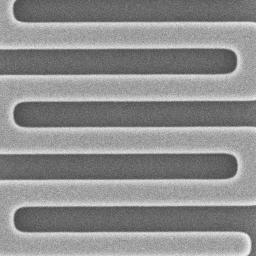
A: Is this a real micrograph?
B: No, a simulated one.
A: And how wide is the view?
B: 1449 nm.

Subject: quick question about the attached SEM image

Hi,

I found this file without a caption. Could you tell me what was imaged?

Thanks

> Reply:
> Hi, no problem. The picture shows groups of lines, slits or small figures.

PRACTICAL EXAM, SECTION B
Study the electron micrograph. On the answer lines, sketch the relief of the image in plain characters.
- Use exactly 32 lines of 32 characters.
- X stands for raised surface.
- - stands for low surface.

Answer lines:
XX------------------------------
XX------------------------------
XX------------------------------
XXXXXXXXXXXXXXXXXXXXXXXXXXXXXXXX
XXXXXXXXXXXXXXXXXXXXXXXXXXXXXXXX
XXXXXXXXXXXXXXXXXXXXXXXXXXXXXXXX
-----------------------------XXX
------------------------------XX
------------------------------XX
-----------XXXXXXXXXXXXXXXXXXXXX
XXXXXXXXXXXXXXXXXXXXXXXXXXXXXXXX
XXXXXXXXXXXXXXXXXXXXXXXXXXXXXXXX
XXXXXXXXXXXXXXXXXXXXXXXXXXXXXXXX
XX------------------------------
XX------------------------------
XX------------------------------
XXXXXXXXXXXXXXXXXXXXXXXXXXXXXXXX
XXXXXXXXXXXXXXXXXXXXXXXXXXXXXXXX
XXXXXXXXXXXXXXXXXXXXXXXXXXXXXXXX
-----------------------------XXX
------------------------------XX
------------------------------XX
----------------------------XXXX
XXXXXXXXXXXXXXXXXXXXXXXXXXXXXXXX
XXXXXXXXXXXXXXXXXXXXXXXXXXXXXXXX
XXXXXXXXXXXXXXXXXXXXXXXXXXXXXXXX
XX------------------------------
XX------------------------------
XX------------------------------
XXXXXXXXXXXXXXXXXXXXXXXXXXXXXXX-
XXXXXXXXXXXXXXXXXXXXXXXXXXXXXXX-
XXXXXXXXXXXXXXXXXXXXXXXXXXXXXXX-